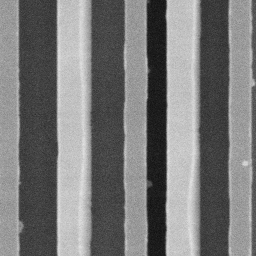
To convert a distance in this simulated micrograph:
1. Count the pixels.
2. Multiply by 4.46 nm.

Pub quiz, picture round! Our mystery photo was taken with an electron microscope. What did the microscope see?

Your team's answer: lines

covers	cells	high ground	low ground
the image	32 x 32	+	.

++.....++++.....++...++++....++.
++.....++++.....++...++++....++.
++.....++++.....++...++++....++.
++.....++++.....++...++++....++.
++.....++++.....++...++++....++.
++.....++++.....++...++++....++.
++.....++++.....++...++++....++.
++.....++++.....++...++++....++.
++.....++++.....++...++++....++.
++.....++++.....++...++++....++.
++.....++++.....++...++++....++.
++.....++++.....++...++++....++.
++.....++++.....++...++++....++.
++.....++++.....++...++++....++.
++.....++++.....++...++++....++.
++.....++++.....++...++++....++.
++.....++++.....++...++++....++.
++.....++++.....++...++++....++.
++.....++++.....++...++++....++.
++.....++++.....++...++++....++.
++.....++++.....++...++++....++.
++.....++++.....++...++++....++.
++.....++++.....++...++++....++.
++.....++++.....++...++++....++.
++.....++++.....++...++++....++.
++.....++++.....++...+++.....++.
++.....++++.....++...+++.....++.
++.....++++.....++...++++....++.
++.....++++.....++...++++....++.
++.....++++.....++...++++....++.
++.....++++.....++...++++....++.
++.....++++.....++...++++....++.